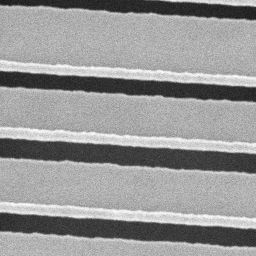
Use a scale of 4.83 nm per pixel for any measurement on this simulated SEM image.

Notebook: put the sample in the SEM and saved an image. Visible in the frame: lines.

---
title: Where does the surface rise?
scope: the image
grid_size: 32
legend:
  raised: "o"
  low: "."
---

...........................ooooo
oooooooooooooo..................
ooooooooooooooooooooooooooooooo.
oooooooooooooooooooooooooooooooo
oooooooooooooooooooooooooooooooo
oooooooooooooooooooooooooooooooo
oooooooooooooooooooooooooooooooo
oooooooooooooooooooooooooooooooo
oooooooooooooooooooooooooooooooo
............oooooooooooooooooooo
...........................ooooo
ooooooooooo.....................
ooooooooooooooooooooooooooo.....
oooooooooooooooooooooooooooooooo
oooooooooooooooooooooooooooooooo
oooooooooooooooooooooooooooooooo
oooooooooooooooooooooooooooooooo
....oooooooooooooooooooooooooooo
.....................ooooooooooo
................................
oooooooooooooo..................
oooooooooooooooooooooooooooo....
oooooooooooooooooooooooooooooooo
oooooooooooooooooooooooooooooooo
oooooooooooooooooooooooooooooooo
oooooooooooooooooooooooooooooooo
.ooooooooooooooooooooooooooooooo
...............ooooooooooooooooo
..............................oo
ooooooo.o.......................
oooooooooooooooooooooooooo......
oooooooooooooooooooooooooooooooo